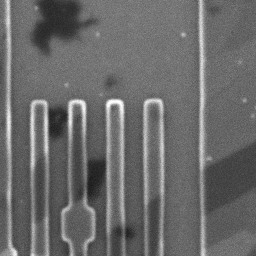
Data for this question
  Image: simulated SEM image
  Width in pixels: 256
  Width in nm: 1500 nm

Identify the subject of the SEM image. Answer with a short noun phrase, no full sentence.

wiring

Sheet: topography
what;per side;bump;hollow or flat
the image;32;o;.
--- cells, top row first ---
o........................ooooooo
o........................ooooooo
o........................ooooooo
o........................ooooooo
o........................ooooooo
o........................ooooooo
o........................ooooooo
o........................ooooooo
o........................ooooooo
o........................ooooooo
o........................ooooooo
o........................ooooooo
o........................ooooooo
o...oo...oo..oo...oo.....ooooooo
o...oo...oo..oo...oo.....ooooooo
o...oo...oo..oo...oo.....ooooooo
o...oo...oo..oo...oo.....ooooooo
o...oo...oo..oo...oo.....ooooooo
o...oo...oo..oo...oo.....ooooooo
o...oo...oo..oo...oo.....ooooooo
o...oo...oo..oo...oo.....ooooooo
o...oo...oo..oo...oo.....ooooooo
o...oo...oo..oo...oo.....ooooooo
o...oo...oo..oo...oo.....ooooooo
o...oo...oo..oo...oo.....ooooooo
o...oo...oo..oo...oo.....ooooooo
o...oo..oooo.oo...oo.....ooooooo
o...oo..oooo.ooo..oo.....ooooooo
o...oo..oooo.ooo..oo.....ooooooo
o...oo..oooo.ooo..oo.....ooooooo
o...oo...oo..ooo..oo.....ooooooo
oo..oo...oo..ooo..oo.....ooooooo